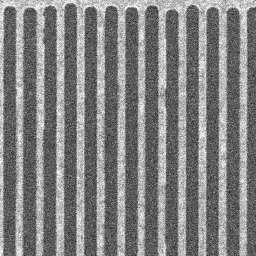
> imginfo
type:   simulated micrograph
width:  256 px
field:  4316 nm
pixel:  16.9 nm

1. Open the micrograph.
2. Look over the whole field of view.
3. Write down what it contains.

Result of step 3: parallel lines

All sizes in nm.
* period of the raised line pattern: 342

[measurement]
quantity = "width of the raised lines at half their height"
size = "103 nm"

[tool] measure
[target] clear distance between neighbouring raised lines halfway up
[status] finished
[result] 0.236 µm